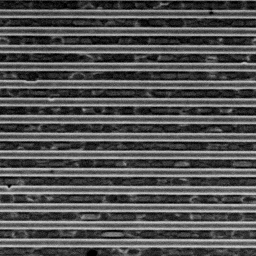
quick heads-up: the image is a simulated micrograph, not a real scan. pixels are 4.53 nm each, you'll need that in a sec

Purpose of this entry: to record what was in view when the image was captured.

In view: parallel lines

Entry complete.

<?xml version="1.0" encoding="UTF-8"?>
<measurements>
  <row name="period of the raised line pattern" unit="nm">79.9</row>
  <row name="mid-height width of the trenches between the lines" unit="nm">43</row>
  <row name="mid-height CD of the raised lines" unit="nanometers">35.1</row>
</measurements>